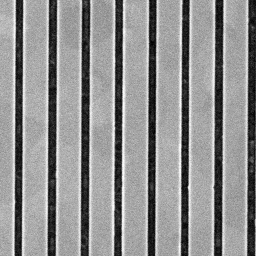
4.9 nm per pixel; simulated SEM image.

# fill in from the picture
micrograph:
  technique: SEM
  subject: parallel lines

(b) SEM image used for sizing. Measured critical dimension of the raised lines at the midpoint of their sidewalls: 124 nm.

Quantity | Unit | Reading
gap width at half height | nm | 42.2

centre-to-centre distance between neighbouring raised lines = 163 nm